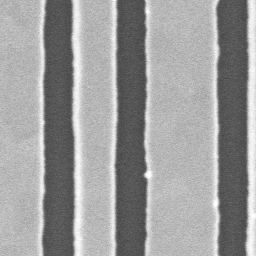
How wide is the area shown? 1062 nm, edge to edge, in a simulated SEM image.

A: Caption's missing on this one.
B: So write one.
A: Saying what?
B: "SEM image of lines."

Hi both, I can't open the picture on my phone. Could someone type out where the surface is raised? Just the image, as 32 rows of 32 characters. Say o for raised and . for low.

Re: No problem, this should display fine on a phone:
oooooo...ooooo....ooooooooo....o
oooooo...oooooo...ooooooooo....o
ooooo....ooooo....ooooooooo....o
ooooo....oooooo...ooooooooo....o
ooooo....ooooo....ooooooooo....o
ooooo....ooooo....ooooooooo....o
ooooo....ooooo....ooooooooo....o
ooooo....ooooo....ooooooooo....o
ooooo....ooooo....ooooooooo....o
ooooo....ooooo....ooooooooo....o
ooooo....ooooo....ooooooooo....o
ooooo....oooooo...ooooooooo....o
ooooo....ooooo....ooooooooo....o
ooooo....oooooo...ooooooooo....o
ooooo....oooooo...ooooooooo....o
ooooo....oooooo...ooooooooo....o
ooooo....ooooo....ooooooooo....o
ooooo....ooooo....ooooooooo....o
ooooo....ooooo....ooooooooo....o
ooooo....ooooo....ooooooooo....o
ooooo....ooooo....ooooooooo....o
ooooo....ooooo....ooooooooo....o
ooooo....ooooo....ooooooooo....o
ooooo....ooooo....ooooooooo....o
ooooo....ooooo....ooooooooo....o
ooooo....ooooo....ooooooooo....o
ooooo....ooooo....ooooooooo....o
ooooo....ooooo....ooooooooo....o
ooooo....ooooo....ooooooooo....o
ooooo....ooooo....ooooooooo....o
ooooo....ooooo....ooooooooo....o
ooooo....ooooo....ooooooooo....o